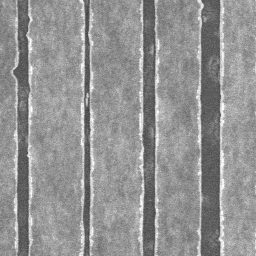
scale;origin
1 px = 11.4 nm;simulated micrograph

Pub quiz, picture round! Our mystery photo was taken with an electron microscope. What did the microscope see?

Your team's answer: one or a few lines or trenches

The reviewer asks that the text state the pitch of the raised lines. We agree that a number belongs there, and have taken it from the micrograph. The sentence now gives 698 nm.